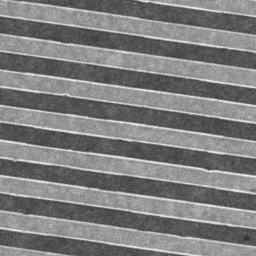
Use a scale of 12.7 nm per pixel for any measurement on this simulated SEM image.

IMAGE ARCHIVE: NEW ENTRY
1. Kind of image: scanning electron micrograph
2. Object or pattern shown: parallel lines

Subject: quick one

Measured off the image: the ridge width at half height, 216 nm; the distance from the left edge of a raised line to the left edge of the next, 0.445 microns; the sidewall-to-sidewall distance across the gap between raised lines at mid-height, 230 nanometres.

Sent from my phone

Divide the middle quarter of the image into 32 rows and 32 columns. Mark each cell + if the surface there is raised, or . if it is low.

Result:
............++++++++++++++++++++
...................+++++++++++++
........................++++++++
...............................+
+++++...........................
++++++++++++....................
+++++++++++++++++++.............
++++++++++++++++++++++++++......
......++++++++++++++++++++++++++
.............+++++++++++++++++++
....................++++++++++++
...........................+++++
................................
++++++..........................
+++++++++++++...................
+++++++++++++++++++++...........
++++++++++++++++++++++++++++....
.....+++++++++++++++++++++++++++
............++++++++++++++++++++
...................+++++++++++++
............................++++
+...............................
++++++++........................
+++++++++++++++.................
++++++++++++++++++++++..........
+++++++++++++++++++++++++++++...
.......+++++++++++++++++++++++++
..............++++++++++++++++++
.....................+++++++++++
............................++++
++..............................
+++++++++.......................